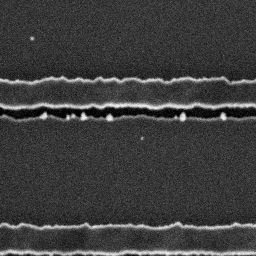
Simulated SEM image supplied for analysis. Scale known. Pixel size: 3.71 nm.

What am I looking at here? lines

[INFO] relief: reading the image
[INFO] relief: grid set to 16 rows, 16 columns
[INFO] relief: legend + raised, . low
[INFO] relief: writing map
................
................
................
................
................
++++++++++++++++
++++++++++++++++
................
................
................
................
................
................
................
++++++++++++++++
++++++++++++++++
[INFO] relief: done